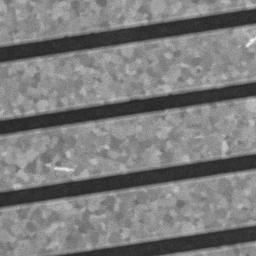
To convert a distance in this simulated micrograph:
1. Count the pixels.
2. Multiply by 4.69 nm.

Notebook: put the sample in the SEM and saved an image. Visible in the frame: one or a few lines or trenches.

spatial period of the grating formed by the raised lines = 335 nm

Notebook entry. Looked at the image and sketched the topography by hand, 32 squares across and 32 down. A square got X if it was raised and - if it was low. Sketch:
XXXXXXXXXXXXXXXXXXXXXXXXXXXXXXXX
XXXXXXXXXXXXXXXXXXXXXXXXXXX-----
XXXXXXXXXXXXXXXXXXXXX-----------
XXXXXXXXXXXXXX----------------XX
XXXXXXX----------------XXXXXXXXX
X----------------XXXXXXXXXXXXXXX
----------XXXXXXXXXXXXXXXXXXXXXX
----XXXXXXXXXXXXXXXXXXXXXXXXXXXX
XXXXXXXXXXXXXXXXXXXXXXXXXXXXXXXX
XXXXXXXXXXXXXXXXXXXXXXXXXXXXXXXX
XXXXXXXXXXXXXXXXXXXXXXXXXXXXX---
XXXXXXXXXXXXXXXXXXXXXX----------
XXXXXXXXXXXXXXX---------------XX
XXXXXXXXX---------------XXXXXXXX
XX---------------XXXXXXXXXXXXXXX
-----------XXXXXXXXXXXXXXXXXXXXX
----XXXXXXXXXXXXXXXXXXXXXXXXXXXX
XXXXXXXXXXXXXXXXXXXXXXXXXXXXXXXX
XXXXXXXXXXXXXXXXXXXXXXXXXXXXXXXX
XXXXXXXXXXXXXXXXXXXXXXXXXXXXX---
XXXXXXXXXXXXXXXXXXXXXX----------
XXXXXXXXXXXXXXXX---------------X
XXXXXXXXX---------------XXXXXXXX
XX----------------XXXXXXXXXXXXXX
-----------XXXXXXXXXXXXXXXXXXXXX
----XXXXXXXXXXXXXXXXXXXXXXXXXXXX
XXXXXXXXXXXXXXXXXXXXXXXXXXXXXXXX
XXXXXXXXXXXXXXXXXXXXXXXXXXXXXXXX
XXXXXXXXXXXXXXXXXXXXXXXXXXXXX---
XXXXXXXXXXXXXXXXXXXXXX----------
XXXXXXXXXXXXXXX----------------X
XXXXXXXXX----------------XXXXXXX